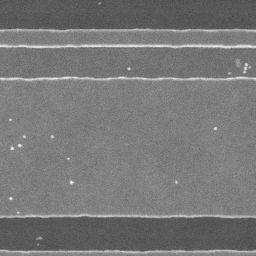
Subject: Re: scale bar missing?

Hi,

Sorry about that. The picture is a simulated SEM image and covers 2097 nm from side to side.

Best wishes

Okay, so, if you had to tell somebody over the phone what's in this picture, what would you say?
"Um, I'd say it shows lines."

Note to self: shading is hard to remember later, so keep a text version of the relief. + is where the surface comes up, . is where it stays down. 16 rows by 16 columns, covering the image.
................
................
++++++++++++++++
++++++++++++++++
++++++++++++++++
++++++++++++++++
++++++++++++++++
++++++++++++++++
++++++++++++++++
++++++++++++++++
++++++++++++++++
++++++++++++++++
++++++++++++++++
++++..+.++++++++
................
................